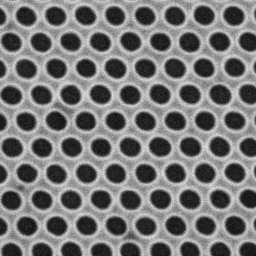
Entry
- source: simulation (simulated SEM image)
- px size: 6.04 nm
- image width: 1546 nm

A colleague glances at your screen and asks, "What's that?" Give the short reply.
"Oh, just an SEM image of a regular array of holes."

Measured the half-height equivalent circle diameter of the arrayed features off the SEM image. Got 125 nanometres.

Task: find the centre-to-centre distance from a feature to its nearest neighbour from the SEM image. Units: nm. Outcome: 178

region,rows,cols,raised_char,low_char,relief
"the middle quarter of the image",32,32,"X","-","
-XX-----XX-----XXX-----XX-----XX
-XX-----XX------XX-----XX------X
XXXX----XXX----XXX-----XXX----XX
XXXXXXXXXXXX--XXXXXX-XXXXXX--XXX
XXXXXXXXXXXXXXXXXXXXXXXXXXXXXXXX
---XXXXX--XXXXX---XXXX---XXXXX--
----XX------XX-----XX-----XXX---
----XX------XX-----XX------XX---
----XXX-----XX-----XX------XX---
----XXX----XXXX----XXX----XXXX--
XXXXXXXXXXXXXXXXXXXXXXXXXXXXXXXX
XXXXXXXXXXXXXXXXXXXXXXXXXXXXXXXX
XXXX---XXXX----XXX----XXXX---XXX
XXX-----XX-----XXX-----XX-----XX
-XX-----XX------XX-----XX------X
-XX-----XXX-----XX-----XXX----XX
XXXXX--XXXXX--XXXXX---XXXXX---XX
XXXXXXXXXXXXXXXXXXXXXXXXXXXXXXXX
X--XXXXX--XXXXX---XXXX---XXXXX--
----XXX----XXX-----XX-----XXX---
-----XX-----XX-----XX------XX---
-----XX-----XX-----XX------XX---
----XXX-----XXX----XXX----XXXX--
XX-XXXXXXXXXXXXXXXXXXXXXXXXXXXXX
XXXXXXXXXXXXXXXXXXXXXXXXXXXXXXXX
XXX----XXXX---XXXXX---XXXX---XXX
XXX-----XX-----XXX-----XX-----XX
-XX-----XX------XX-----XX------X
-XX-----XXX----XXX-----XXX----XX
XXXX---XXXXX---XXXX---XXXXX---XX
XXXXXXXXXXXXXXXXXXXXXXXXXXXXXXXX
X-XXXXXX--XXXXXX-XXXXXX--XXXXX--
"